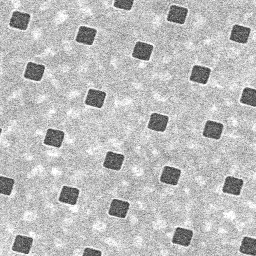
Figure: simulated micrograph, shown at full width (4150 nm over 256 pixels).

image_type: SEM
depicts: a regular array of holes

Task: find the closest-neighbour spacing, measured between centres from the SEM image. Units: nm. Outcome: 894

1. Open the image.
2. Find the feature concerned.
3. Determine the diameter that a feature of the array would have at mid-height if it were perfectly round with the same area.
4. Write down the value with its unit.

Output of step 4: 0.324 microns